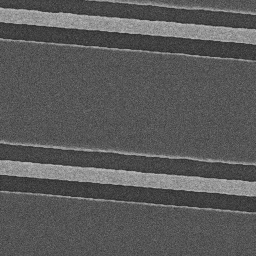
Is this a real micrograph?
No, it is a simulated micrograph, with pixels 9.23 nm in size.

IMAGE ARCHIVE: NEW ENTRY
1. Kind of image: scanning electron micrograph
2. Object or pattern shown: lines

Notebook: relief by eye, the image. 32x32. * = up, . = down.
..................**************
*****........................***
******************..............
.........********************...
.....................***********
*******........................*
*******************.............
*******************************.
********************************
********************************
********************************
********************************
********************************
********************************
********************************
********************************
********************************
********************************
.......*************************
..................**************
*****.........................**
*****************...............
........*********************...
....................************
********........................
*******************.............
******************************..
********************************
********************************
********************************
********************************
********************************